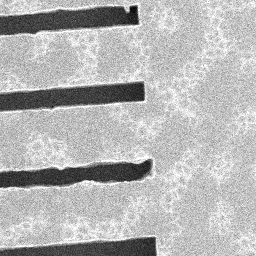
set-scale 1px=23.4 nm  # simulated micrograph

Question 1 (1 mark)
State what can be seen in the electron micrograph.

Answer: one or a few lines or trenches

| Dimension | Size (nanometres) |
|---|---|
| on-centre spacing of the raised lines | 1810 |